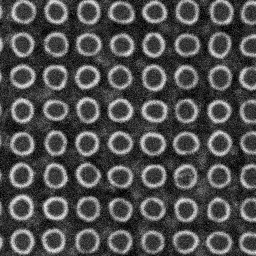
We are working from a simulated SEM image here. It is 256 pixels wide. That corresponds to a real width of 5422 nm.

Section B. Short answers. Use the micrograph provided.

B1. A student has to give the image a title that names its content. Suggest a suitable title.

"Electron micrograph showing a regular array of raised bodies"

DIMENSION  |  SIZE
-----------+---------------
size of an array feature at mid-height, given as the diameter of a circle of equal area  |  21 px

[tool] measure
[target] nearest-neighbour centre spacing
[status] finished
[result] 678 nm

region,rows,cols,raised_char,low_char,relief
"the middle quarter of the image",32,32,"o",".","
................................
....oooo....oooo.....ooo.....ooo
...ooooo...ooooo....ooooo...oooo
...ooooo...ooooo....ooooo...oooo
...ooooo....oooo....ooooo...oooo
....ooo......oo......ooo.....ooo
................................
................................
................................
....ooo......oo..............ooo
o...oooo....oooo....ooooo...oooo
o...oooo...oooooo...ooooo...oooo
....oooo...oooooo...ooooo...oooo
....oooo....oooo.....oooo....ooo
................................
................................
................................
.....o.......oo...............o.
....oooo....oooo....oooo....oooo
...ooooo....ooooo...ooooo...oooo
...ooooo....ooooo...ooooo...oooo
....oooo....oooo....ooooo...oooo
.....o...............oo.........
................................
................................
.....oo.........................
....oooo....oooo.....oooo....ooo
....ooooo..oooooo...ooooo...oooo
....ooooo..oooooo...ooooo...oooo
....oooo....ooooo...ooooo...oooo
..............o.......o......ooo
................................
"